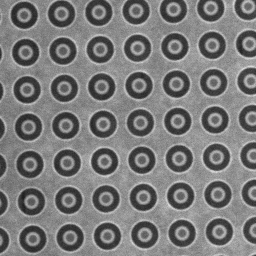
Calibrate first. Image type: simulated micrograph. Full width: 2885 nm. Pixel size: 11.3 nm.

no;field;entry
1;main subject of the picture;an array of small figures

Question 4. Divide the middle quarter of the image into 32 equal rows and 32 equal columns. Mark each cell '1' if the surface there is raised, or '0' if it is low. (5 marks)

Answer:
11111111111111111111111111111111
11111111111111111111111111101111
01111111000111111000011111000001
00011110000011110000001110000001
00011100010001100011001110011000
11001100111001100111001100011000
11001100111001100011001110000001
10011100000001110000001111000001
00011110000011111000111111100111
01111111111111111111111111111111
11111111111111111111111111111111
11111111101111111100011111000001
00111110000011110000001110000001
00001110000001110011001110011100
11001100111001100011100110011100
11001100111001110011000110001000
10001110010001110000001111000001
00011110000011111000011111100011
00111111100111111111111111111111
11111111111111111111111111111111
11111111111111111110111111100011
00111111000011111000001111000000
00001110000001110000000110001100
11001110011000110011100110011100
11001100011100110011100110001100
11001110011000110000000111000000
00001110000001111000001111100001
00011111000011111110011111111111
11111111111111111111111111111111
11111111111111111111111111111011
11111111100011111100001111100000
00001111000001111000000111000000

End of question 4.